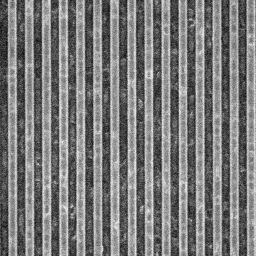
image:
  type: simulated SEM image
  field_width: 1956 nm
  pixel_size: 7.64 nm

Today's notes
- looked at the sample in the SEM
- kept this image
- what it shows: parallel lines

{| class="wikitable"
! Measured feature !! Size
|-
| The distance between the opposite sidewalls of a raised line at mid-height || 59.2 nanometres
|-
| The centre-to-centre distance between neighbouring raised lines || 130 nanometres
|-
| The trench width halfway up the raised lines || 70.7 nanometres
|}